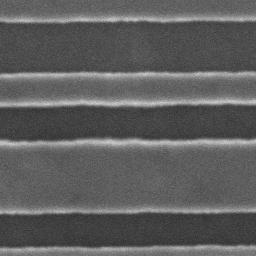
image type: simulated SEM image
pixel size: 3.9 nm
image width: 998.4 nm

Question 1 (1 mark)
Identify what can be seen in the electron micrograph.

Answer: lines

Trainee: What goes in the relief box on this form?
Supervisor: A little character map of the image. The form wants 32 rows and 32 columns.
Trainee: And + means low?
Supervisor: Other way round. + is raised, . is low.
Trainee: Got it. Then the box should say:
++++++++++++++++++++++++++++++++
++++++++++++++++++++++++++++++++
++++++++++++++.++.+++++.........
................................
................................
................................
................................
................................
................................
++++++++++++++++++++++++++++++++
++++++++++++++++++++++++++++++++
++++++++++++++++++++++++++++++++
++++++++++++++++++++++++++++++++
................................
................................
................................
................................
................................
++++++++++++++++++++++++++++++++
++++++++++++++++++++++++++++++++
++++++++++++++++++++++++++++++++
++++++++++++++++++++++++++++++++
++++++++++++++++++++++++++++++++
++++++++++++++++++++++++++++++++
++++++++++++++++++++++++++++++++
++++++++++++++++++++++++++++++++
+++++++++.+++++++......+++++....
................................
................................
................................
................................
++++++++++++++++++++++++++++++++